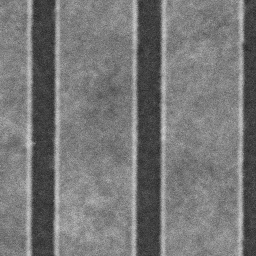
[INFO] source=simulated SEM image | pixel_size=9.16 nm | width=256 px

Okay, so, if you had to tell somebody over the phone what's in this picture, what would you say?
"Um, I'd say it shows one or a few lines or trenches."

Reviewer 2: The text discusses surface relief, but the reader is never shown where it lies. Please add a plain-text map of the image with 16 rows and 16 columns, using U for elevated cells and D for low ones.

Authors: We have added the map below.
UUDDUUUUDDUUUUUD
UUDDUUUUDDUUUUUD
UUDDUUUUDDUUUUUD
UUDDUUUUDDUUUUUD
UUDDUUUUDDUUUUUD
UUDDUUUUDDUUUUUD
UUDDUUUUDDUUUUUD
UUDDUUUUDDUUUUUD
UUDDUUUUDDUUUUUD
UUDDUUUUDDUUUUUD
UUDDUUUUDDUUUUUD
UUDDUUUUDDUUUUUD
UUDDUUUUDDUUUUUD
UUDDUUUUDDUUUUUD
UUDDUUUUDDUUUUUD
UUDDUUUUDDUUUUUD